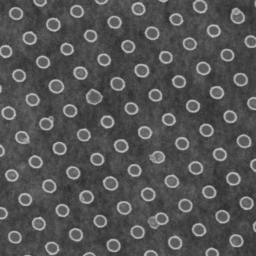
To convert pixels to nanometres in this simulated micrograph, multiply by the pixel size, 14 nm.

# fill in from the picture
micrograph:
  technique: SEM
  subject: a regular array of raised bodies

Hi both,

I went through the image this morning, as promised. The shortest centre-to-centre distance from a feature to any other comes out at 381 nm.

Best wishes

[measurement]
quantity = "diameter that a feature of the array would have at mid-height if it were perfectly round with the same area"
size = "168 nanometres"